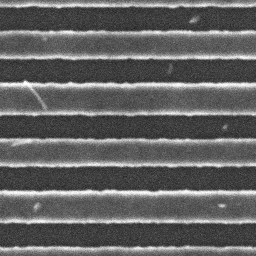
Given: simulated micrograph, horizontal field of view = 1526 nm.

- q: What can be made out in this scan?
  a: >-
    lines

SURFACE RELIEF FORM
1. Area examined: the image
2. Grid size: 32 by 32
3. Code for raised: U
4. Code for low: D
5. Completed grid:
UUUUUUUUUUUUUUUUUUUUUUUUUUUUUUUU
DDDDDDDDDDDDDDDDDDDDDDDDDDDDDDDD
DDDDDDDDDDDDDDDDDDDDDDDDDDDDDDDD
DDDDDDDDDDDDDDDDDDDDDDDDDDDDDDDD
UUUUUUUUUUUUUUUUUUUUUUUUUUUUUUUU
UUUUUUUUUUUUUUUUUUUUUUUUUUUUUUUU
UUUUUUUUUUUUUUUUUUUUUUUUUUUUUUUU
DDDDDDDDDDDDDDDDDDDDDDDDDDDDDDDD
DDDDDDDDDDDDDDDDDDDDDDDDDDDDDDDD
DDDDDDDDDDDDDDDDDDDDDDDDDDDDDDDD
UUUUUDUDUDDUDUDDDDUUUDUDDUUUUDDU
UUUUUUUUUUUUUUUUUUUUUUUUUUUUUUUU
UUUUUUUUUUUUUUUUUUUUUUUUUUUUUUUU
UUUUUUUUUUUUUUUUUUUUUUUUUUUUUUUU
DDDDDDDDDDDDDDDDDDDDDDDDDDDDDDDD
DDDDDDDDDDDDDDDDDDDDDDDDDDDDDDDD
DDDDDDDDDDDDDDDDDDDDDDDDDDDDDDDD
UUUUUUUUUUUUDUUUUUUUUDUUDDDUUUUU
UUUUUUUUUUUUUUUUUUUUUUUUUUUUUUUU
UUUUUUUUUUUUUUUUUUUUUUUUUUUUUUUU
UUUUUUUUUUUUUUUUUUUUUUUUUUUUUUUU
DDDDDDDDDDDDDDDDDDDDDDDDDDDDDDDD
DDDDDDDDDDDDDDDDDDDDDDDDDDDDDDDD
DDDDDDDDDDDDDDDDDDDDDDDDDDDDDDDD
UUUUUUUUUUUUUUUUUUUUUUUUUUUUUUUU
UUUUUUUUUUUUUUUUUUUUUUUUUUUUUUUU
UUUUUUUUUUUUUUUUUUUUUUUUUUUUUUUU
UUUUUUUUUUUUUUUUUUUUUUUUUUUUUUUU
DDDDDDDDDDDDDDDDDDDDDDDDDDDDDDDD
DDDDDDDDDDDDDDDDDDDDDDDDDDDDDDDD
DDDDDDDDDDDDDDDDDDDDDDDDDDDDDDDD
UUUUUUUUUUUUUUUUUUUUUUUUUUUUUUUU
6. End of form